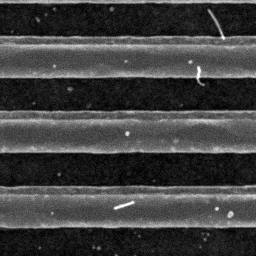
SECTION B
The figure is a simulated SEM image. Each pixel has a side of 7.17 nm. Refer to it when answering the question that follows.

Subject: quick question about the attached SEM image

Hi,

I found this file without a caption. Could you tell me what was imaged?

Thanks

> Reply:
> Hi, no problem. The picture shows lines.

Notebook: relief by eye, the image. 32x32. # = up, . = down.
................................
................................
................................
................................
................................
################################
################################
################################
################################
################################
................................
................................
................................
................................
################################
################################
################################
################################
################################
................................
................................
................................
................................
################################
################################
################################
################################
################################
................................
................................
................................
................................